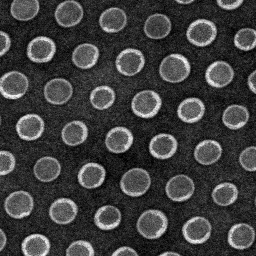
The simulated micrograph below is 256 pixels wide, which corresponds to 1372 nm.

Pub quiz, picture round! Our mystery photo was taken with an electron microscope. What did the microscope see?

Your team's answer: a regular array of raised bodies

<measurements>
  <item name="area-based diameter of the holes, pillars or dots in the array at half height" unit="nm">140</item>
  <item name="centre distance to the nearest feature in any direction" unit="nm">239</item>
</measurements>